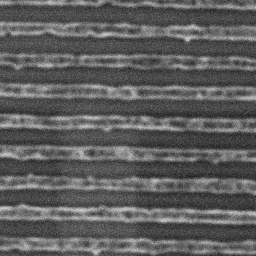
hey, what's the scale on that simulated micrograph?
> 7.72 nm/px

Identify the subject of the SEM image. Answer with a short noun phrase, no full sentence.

parallel lines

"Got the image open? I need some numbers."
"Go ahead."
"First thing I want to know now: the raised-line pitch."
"237 nm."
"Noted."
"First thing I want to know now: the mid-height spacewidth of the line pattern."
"20.4 pixels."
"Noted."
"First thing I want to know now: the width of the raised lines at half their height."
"0.0801 um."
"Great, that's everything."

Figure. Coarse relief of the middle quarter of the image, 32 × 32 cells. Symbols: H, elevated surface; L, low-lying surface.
LLLLLLLLLLLLLLLLLHHHHHHHHHHHLHHH
LLLLLLLLLLLLLLLLLLLLLLLLLLLLLLLL
LLLLLLLLLLLLLLLLLLLLLLLLLLLLLLLL
LLLLLLLLLLLLLLLLLLLLLLLLLLLLLLLL
LLLLLLLLLLLLLLLLLLLLLLLLLLLLLLLL
LLHHHHHLLLLLLLLLLLLLLLLLLLLLLLLL
HHHHHHHHHHHHHHHHHHHHHHHHHHHHHHHH
HHHHHHHHHHHHHHHHHHHHHHHHHHHHHHHH
LLLLLLLLLLLLLLHHHLLHLLLLLLLLLHHH
LLLLLLLLLLLLLLLLLLLLLLLLLLLLLLLL
LLLLLLLLLLLLLLLLLLLLLLLLLLLLLLLL
LLLLLLLLLLLLLLLLLLLLLLLLLLLLLLLL
LLLLLLLLLLLLLLLLLLLLLLLLLLLLLLLL
LLHHHHHLLHHHHHHHHHLHHLLLLLLLLLLL
HHHHHHHHHHHHHHHHHHHHHHHHHHHHHHHH
HHHHHHHHHHHHHHHHHHHHHHHHHHHHHHHH
LLLLLLLLLLLLLLLLLLLLLLLLLLLLLLLL
LLLLLLLLLLLLLLLLLLLLLLLLLLLLLLLL
LLLLLLLLLLLLLLLLLLLLLLLLLLLLLLLL
LLLLLLLLLLLLLLLLLLLLLLLLLLLLLLLL
LLLLLLLLLLLLLLLLLLLLLLLLLLLLLLLL
HHHHHHHHHHHHHHHHHHHHHHHHLHHHLLLL
HHHHHHHHHHHHHHHHHHHHHHHHHHHHHHHH
HHHHHHHHHHHHHHHHHHHHHHHHHHHHHHHH
LLLLLLLLLLLLLLLLLLLLLLLLLLLLLLLL
LLLLLLLLLLLLLLLLLLLLLLLLLLLLLLLL
LLLLLLLLLLLLLLLLLLLLLLLLLLLLLLLL
LLLLLLLLLLLLLLLLLLLLLLLLLLLLLLLL
LLLLLLHLLLLLLLLLLLLLLLLLLLLLLLLL
HHHHHHHHHHHHHHHHHHHHHHHHHHHHHHHH
HHHHHHHHHHHHHHHHHHHHHHHHHHHHHHHH
LLLLLLLLLLLLLLLLLLLLLLHHHHHHHHHH